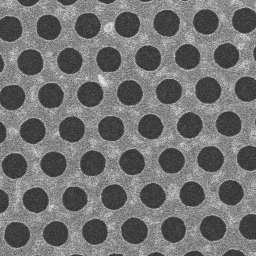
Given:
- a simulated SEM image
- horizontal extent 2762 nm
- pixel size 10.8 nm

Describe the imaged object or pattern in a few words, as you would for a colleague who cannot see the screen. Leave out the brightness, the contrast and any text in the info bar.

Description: a regular array of holes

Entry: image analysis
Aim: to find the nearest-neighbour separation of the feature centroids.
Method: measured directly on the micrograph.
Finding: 0.421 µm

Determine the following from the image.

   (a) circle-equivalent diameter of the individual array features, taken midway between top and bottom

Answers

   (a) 282 nanometers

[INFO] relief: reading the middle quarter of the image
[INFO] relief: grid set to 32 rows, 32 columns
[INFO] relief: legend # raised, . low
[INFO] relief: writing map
....#####.....####......#####...
....#####....#######...#########
#.##############################
################################
#####...#######...######.....###
####.....#####.....####......###
###.......###.......###.......##
###.......###.......###......###
###.......###......####......###
####.....#####.....#####....####
#####...########################
################################
#####################.########..
....######....#####.....#####...
.....####......####......###....
.....###.......###.......###....
.....###.......###.......###....
.....####......####.....#####...
.....####.....#######..#######..
#..#############################
################################
################..#######....###
#####.....#####....#####......##
####......####......####......##
.###.......###......####......##
.###......####......####......##
####......#####.....#####....###
#####....#######...#############
################################
###############################.
###########...######....######..
.....#####.....####......####...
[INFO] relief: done